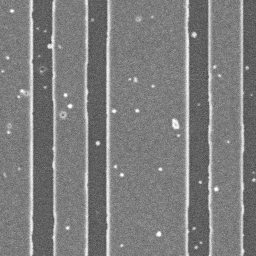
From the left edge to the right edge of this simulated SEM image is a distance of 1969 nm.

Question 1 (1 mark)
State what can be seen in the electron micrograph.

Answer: lines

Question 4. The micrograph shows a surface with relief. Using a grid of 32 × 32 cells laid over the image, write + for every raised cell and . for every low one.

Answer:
++++...++++...+++++++++...++++..
++++...++++...++++++++++..++++..
++++...++++...++++++++++..++++..
++++...++++...+++++++++...++++..
++++...++++...+++++++++...++++..
++++...++++..+++++++++++..++++..
++++...++++..+++++++++++..++++..
++++...++++..+++++++++++..++++..
++++...++++..+++++++++++..++++..
++++...++++..+++++++++++..++++..
++++...++++..+++++++++++..++++..
++++...++++..+++++++++++..++++..
++++...++++..+++++++++++..++++..
++++...++++..+++++++++++..++++..
++++...++++..+++++++++++..++++..
++++...++++..+++++++++++..++++..
++++...++++..+++++++++++..++++..
++++...++++..+++++++++++..++++..
++++...++++..+++++++++++..++++..
++++...++++..+++++++++++..++++..
++++...++++..+++++++++++..++++..
++++...++++..+++++++++++..++++..
++++...++++..+++++++++++..++++..
++++...++++..+++++++++++..++++..
++++...++++..+++++++++++..++++..
++++...++++..+++++++++++..++++..
++++...++++..++++++++++...++++..
++++...++++...+++++++++...++++..
++++...++++...+++++++++...++++..
++++...++++..++++++++++...++++..
++++...++++..++++++++++...++++..
++++...++++..++++++++++...++++..